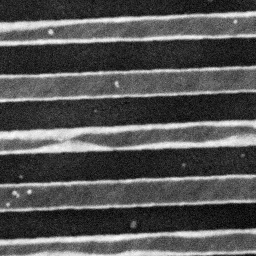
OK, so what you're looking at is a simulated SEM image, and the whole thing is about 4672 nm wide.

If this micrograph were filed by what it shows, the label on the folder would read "lines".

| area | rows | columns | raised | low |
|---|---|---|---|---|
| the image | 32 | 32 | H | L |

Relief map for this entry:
LLLLLLLLLLLLLLLLLLLLLLLLLLLLLLLL
LLLLLLLLLLLLLLLLLLLLLLLLLLLLLLLL
LLLLLLLLLLLLHHHHHHHHHHHHHHHHHHHH
HHHHHHHHHHHHHHHHHHHHHHHHHHHHHHHH
HHHHHHHHHHHHHHHHHHHHHHHHHHHHHHLL
HHHLLLLLLLLLLLLLLLLLLLLLLLLLLLLL
LLLLLLLLLLLLLLLLLLLLLLLLLLLLLLLL
LLLLLLLLLLLLLLLLLLLLLLLLLLLLLLLL
LLLLLLLLLLLLLLLLLLLLLLLLLLLLHHHH
HHHHHHHHHHHHHHHHHHHHHHHHHHHHHHHH
HHHHHHHHHHHHHHHHHHHHHHHHHHHHHHHH
HHHHHHHHHHHHHHHHHHHHHHHHHHHHHHLL
HHHLLLLLLLLLLLLLLLLLLLLLLLLLLLLL
LLLLLLLLLLLLLLLLLLLLLLLLLLLLLLLL
LLLLLLLLLLLLLLLLLLLLLLLLLLLLLLLL
LLLLLLLLLLLLLLLLLLLLLLLHHHHHHHHH
LLLLLLLLHHHHHHHHHHHHHHHHHHHHHHHH
HHHHHHHHHHHHHHHHHHHHHHHHHHHHHHHH
HHHHHHHHHHHHHHHHHHLLLLLLLLLLLLLL
LLLLLLLLLLLLLLLLLLLLLLLLLLLLLLLL
LLLLLLLLLLLLLLLLLLLLLLLLLLLLLLLL
LLLLLLLLLLLLLLLLLLLLLLLLLLLLLLLL
LLLLLLLLLLLLLLLLLHHHHHHHHHHHHHHH
HHHHHHHHHHHHHHHHHHHHHHHHHHHHHHHH
HHHHHHHHHHHHHHHHHHHHHHHHHHHHHHHH
HHHHHHHHHHHHHHHHHHHHHHHHHLLLLLLL
LLLLLLLLLLLLLLLLLLLLLLLLLLLLLLLL
LLLLLLLLLLLLLLLLLLLLLLLLLLLLLLLL
LLLLLLLLLLLLLLLLLLLLLLLLLLLLLLLL
LLLLLLLLLLLLLLLLHHHHHHHHHHHHHHHH
HHHHHHHHHHHHHHHHHHHHHHHHHHHHHHHH
HHHHHHHHHHHHHHHHHHHHHHHHHHHHHHHH